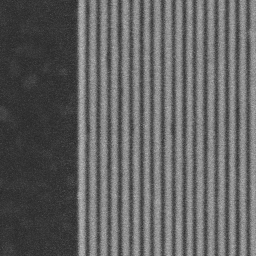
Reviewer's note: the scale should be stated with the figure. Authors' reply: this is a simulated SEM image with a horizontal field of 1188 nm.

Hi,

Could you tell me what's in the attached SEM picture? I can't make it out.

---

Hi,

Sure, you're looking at parallel lines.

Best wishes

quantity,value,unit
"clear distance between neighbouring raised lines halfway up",0.0185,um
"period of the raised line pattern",0.0497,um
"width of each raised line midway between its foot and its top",0.0319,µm